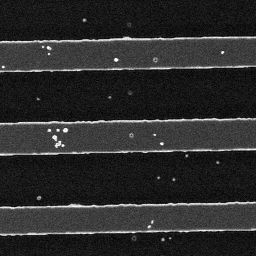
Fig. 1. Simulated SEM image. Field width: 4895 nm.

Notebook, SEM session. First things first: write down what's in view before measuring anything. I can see lines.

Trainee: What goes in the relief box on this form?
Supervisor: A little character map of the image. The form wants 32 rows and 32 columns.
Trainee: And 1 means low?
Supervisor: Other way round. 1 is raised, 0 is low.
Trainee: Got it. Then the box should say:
00000000000000000000000000000000
00000000000000000000000000000000
00000000000000000000000000000000
00000000000000000000000000000000
00000000000000000000000000000000
11111111111111111111111111111111
11111111111111111111111111111111
11111111111111111111111111111111
11111111111111111111110000000000
00000000000000000000000000000000
00000000000000000000000000000000
00000000000000000000000000000000
00000000000000000000000000000000
00000000000000000000000000000000
00000000000000000000000000000000
11111111111111111111111111111111
11111111111111111111111111111111
11111111111111111111111111111111
11111111111111111111111111111111
00000000000000000000000000000000
00000000000000000000000000000000
00000000000000000000000000000000
00000000000000000000000000000000
00000000000000000000000000000000
00000000000000000000000000000000
00000000000000000000011111111111
11111111111111111111111111111111
11111111111111111111111111111111
11111111111111111111111111111111
00000000000000000000000000000000
00000000000000000000000000000000
00000000000000000000000000000000